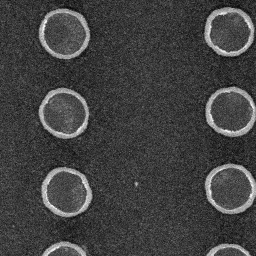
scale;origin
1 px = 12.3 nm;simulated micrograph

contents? raised bodies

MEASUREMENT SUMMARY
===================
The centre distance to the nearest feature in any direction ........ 973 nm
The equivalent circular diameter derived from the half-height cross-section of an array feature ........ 573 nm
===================